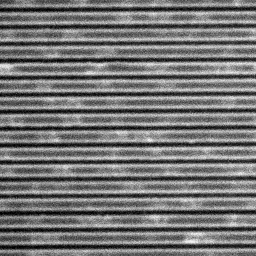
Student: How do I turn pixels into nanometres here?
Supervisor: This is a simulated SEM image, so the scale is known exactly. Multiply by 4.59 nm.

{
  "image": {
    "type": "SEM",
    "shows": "parallel lines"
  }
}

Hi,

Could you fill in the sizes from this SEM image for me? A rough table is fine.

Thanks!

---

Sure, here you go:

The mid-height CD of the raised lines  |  48.8 nanometres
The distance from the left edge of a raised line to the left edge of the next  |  0.0777 microns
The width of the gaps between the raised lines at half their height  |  0.0287 microns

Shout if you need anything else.